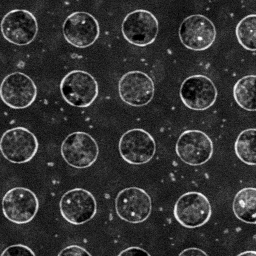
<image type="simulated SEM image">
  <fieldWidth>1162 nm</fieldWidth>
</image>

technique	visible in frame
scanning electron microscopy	a regular array of raised bodies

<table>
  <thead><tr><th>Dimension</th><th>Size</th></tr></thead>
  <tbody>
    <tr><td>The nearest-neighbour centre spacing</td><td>0.259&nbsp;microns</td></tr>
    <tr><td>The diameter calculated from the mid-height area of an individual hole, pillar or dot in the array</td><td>161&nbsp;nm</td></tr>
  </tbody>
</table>